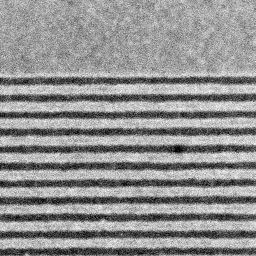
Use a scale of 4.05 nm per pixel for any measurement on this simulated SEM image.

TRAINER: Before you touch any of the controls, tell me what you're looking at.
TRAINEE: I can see parallel lines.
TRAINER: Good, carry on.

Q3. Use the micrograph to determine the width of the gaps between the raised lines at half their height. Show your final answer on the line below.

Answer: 32.4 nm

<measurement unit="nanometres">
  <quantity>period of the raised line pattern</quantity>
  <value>69.2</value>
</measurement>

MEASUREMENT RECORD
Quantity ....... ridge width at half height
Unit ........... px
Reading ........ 9.11